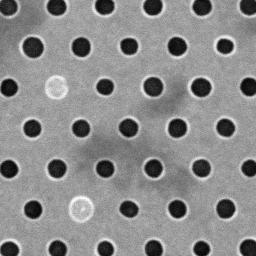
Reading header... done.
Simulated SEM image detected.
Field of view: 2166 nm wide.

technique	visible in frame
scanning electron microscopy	a regular array of holes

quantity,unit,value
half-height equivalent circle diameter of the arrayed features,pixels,19.8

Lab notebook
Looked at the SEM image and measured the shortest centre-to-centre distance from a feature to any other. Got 398 nanometres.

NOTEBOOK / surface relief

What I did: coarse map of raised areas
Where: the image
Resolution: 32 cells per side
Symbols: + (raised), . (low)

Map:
..++++..++++..++++..++++..++++..
..++++..++++..++++..++++..++++..
++++++++++++++++++++++++++++++++
++++++++++++++++++++++++++++++++
++++++++++++++++++++++++++++++++
+++..++++..++++..++++..++++..+++
+++..++++..++++..++++..++++..+++
++++++++++++++++++++++++++++++++
++++++++++++++++++++++++++++++++
++++++++++++++++++++++++++++++++
..++++++++++..++++..++++..++++..
..++++++++++..++++..++++..++++..
++++++++++++++++++++++++++++++++
++++++++++++++++++++++++++++++++
++++++++++++++++++++++++++++++++
+++..++++..++++..++++..++++..+++
+++..++++..++++..++++..++++..+++
++++++++++++++++++++++++++++++++
++++++++++++++++++++++++++++++++
++++++++++++++++++++++++++++++++
..++++..++++..++++..++++..++++..
..++++..++++..++++..++++..++++..
++++++++++++++++++++++++++++++++
++++++++++++++++++++++++++++++++
++++++++++++++++++++++++++++++++
+++..++++..++++..++++..++++..+++
+++..++++..++++..++++..++++..+++
++++++++++++++++++++++++++++++++
++++++++++++++++++++++++++++++++
++++++++++++++++++++++++++++++++
..++++..++++..++++..++++..++++..
..++++..++++..++++..++++..++++..